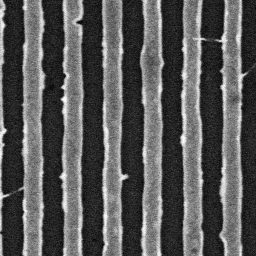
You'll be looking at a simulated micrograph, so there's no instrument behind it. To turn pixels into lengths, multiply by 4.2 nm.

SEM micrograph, parallel lines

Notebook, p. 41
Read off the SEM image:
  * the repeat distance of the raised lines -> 167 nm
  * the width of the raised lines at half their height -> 0.0797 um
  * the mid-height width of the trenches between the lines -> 88.1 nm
